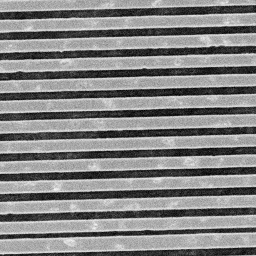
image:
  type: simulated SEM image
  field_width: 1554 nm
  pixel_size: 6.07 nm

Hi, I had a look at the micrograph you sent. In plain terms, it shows parallel lines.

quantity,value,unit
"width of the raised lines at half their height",72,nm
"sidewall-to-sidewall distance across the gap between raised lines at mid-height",50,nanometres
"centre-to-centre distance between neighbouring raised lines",122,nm